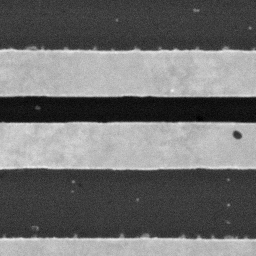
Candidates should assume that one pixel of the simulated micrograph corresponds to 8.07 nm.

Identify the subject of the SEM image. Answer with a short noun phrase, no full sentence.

lines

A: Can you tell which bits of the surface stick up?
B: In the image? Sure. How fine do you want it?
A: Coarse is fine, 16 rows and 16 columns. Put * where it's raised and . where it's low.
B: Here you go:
................
................
................
****************
****************
****************
................
................
****************
****************
****************
................
................
................
................
****************